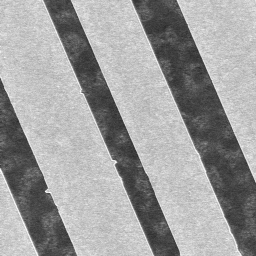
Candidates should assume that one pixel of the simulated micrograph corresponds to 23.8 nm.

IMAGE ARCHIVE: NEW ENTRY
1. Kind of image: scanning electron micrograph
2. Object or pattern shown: one or a few lines or trenches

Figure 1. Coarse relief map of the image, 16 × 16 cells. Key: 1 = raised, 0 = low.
1110011100011111
1110011110001111
1111001110001111
1111001111000111
1111101111000111
1111100111100111
0111100111100011
0111110011100011
0011110011110001
0011111001110001
0001111001111000
0001111101111000
1001111100111100
1000111100111100
1100111110011100
1100011110011110